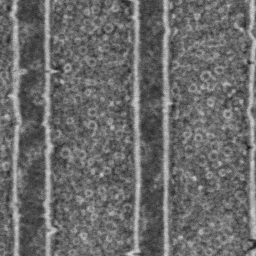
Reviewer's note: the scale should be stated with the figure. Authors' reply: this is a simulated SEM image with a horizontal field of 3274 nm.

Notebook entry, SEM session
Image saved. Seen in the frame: one or a few lines or trenches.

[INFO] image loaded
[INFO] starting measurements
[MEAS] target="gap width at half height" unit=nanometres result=1130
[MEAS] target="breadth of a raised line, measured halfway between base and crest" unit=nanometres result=387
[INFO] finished